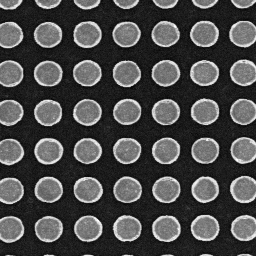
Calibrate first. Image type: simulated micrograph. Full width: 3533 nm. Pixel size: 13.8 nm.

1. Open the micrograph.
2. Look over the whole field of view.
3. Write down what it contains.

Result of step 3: a regular array of raised bodies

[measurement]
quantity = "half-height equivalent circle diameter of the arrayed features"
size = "0.358 microns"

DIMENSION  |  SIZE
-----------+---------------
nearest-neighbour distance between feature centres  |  38.4 px